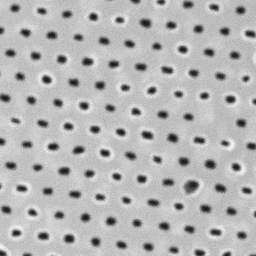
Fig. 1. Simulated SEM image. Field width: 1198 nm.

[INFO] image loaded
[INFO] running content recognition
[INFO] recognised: a regular array of holes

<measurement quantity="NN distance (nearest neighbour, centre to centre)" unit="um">0.119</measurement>